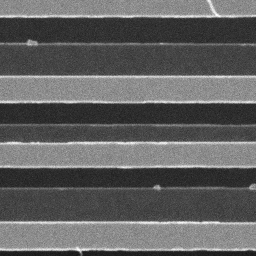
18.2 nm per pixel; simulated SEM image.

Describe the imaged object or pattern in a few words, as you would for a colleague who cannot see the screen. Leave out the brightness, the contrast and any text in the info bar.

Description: lines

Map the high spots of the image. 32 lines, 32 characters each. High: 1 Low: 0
11111111111111111111111111111111
11111111111111111111111111111111
00000000000000000000000000000000
00000000000000000000000000000000
00000000000000000000000000000000
10111000000000000000100000000000
11111111111111111111111111111111
11111111111111111111111111111111
11111111111111111111111111111111
11111111111111111111111111111111
11111111111111111111111111111111
11111111111111111111111111111111
11111111111111111111111111111111
00000000000000000000000000000000
00000000000000000000000000000000
00000000000000000000000000000000
11111111111111111111111111111111
11111111111111111111111111111111
11111111111111111111111111111111
11111111111111111111111111111111
11111111111111111111111111111111
00000000000000000000000000000000
00000000000000000000000000000000
00000000000000000001000000000001
11111111111111111111111111111111
11111111111111111111111111111111
11111111111111111111111111111111
11111111111111111111111111111111
11111111111111111111111111111111
11111111111111111111111111111111
11111111111111111111111111111111
00000000000000000000000000000000